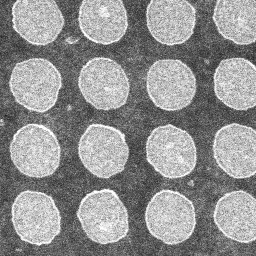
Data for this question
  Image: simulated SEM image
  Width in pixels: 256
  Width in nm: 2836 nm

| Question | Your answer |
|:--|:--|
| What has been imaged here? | a regular array of raised bodies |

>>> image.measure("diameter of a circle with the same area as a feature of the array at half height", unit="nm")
564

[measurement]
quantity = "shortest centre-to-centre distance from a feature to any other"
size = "738 nm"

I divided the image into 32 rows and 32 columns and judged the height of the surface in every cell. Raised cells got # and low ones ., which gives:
..#####...#####....#####...#####
..######..######..######...#####
..######..######..######...#####
..######..######...#####...#####
...####....####....#####....####
.....................#........#.
................................
....#.......##......##......###.
..#####...#####....#####...#####
.#######..######...#####...#####
.#######..######..######...#####
..#####...######...#####...#####
..#####....#####...#####....####
...###......##......###......##.
................................
.............................#..
..####.....####....####....#####
..#####...######..######...#####
.######...######..######...#####
..#####...######..######...#####
..#####....#####...#####...#####
...####....####.....####....####
................................
................................
..####.....####....####.....###.
..#####...#####....#####...#####
..#####...######..######...#####
..#####...######..######...#####
..#####...######...#####...#####
...####....####....#####.....###
....#...........................
................................